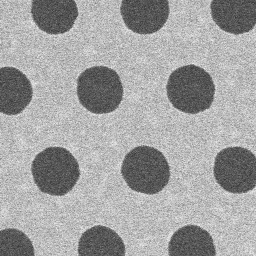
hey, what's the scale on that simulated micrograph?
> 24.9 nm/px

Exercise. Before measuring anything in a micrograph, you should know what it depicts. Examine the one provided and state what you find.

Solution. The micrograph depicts holes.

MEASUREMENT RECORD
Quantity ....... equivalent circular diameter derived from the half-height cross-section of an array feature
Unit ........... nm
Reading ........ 1240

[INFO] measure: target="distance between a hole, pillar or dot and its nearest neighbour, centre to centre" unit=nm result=2260